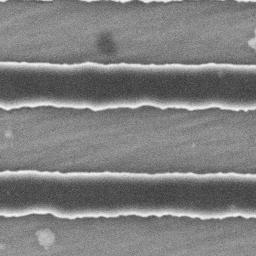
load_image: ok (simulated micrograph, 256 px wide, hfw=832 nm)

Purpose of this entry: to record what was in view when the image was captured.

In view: lines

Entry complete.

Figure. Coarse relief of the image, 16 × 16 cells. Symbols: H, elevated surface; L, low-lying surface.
LLLLLLLLLLLLLLLL
LLLLLLLLLLLLLLLL
LLLLLLLLLLLLLLLL
LLLLLLLLLLLLLLLL
HHHHHHHHHHHHHHHH
HHHHHHHHHHHHHHHH
HHHHHHHHHHHHHHHH
LLLLLLLLLLLLLLLL
LLLLLLLLLLLLLLLL
LLLLLLLLLLLLLLLL
LLLLLLLLLLLLLLLL
HHHHHHHHHHHHHHHH
HHHHHHHHHHHHHHHH
HLLLHHHLLLLHHHHH
LLLLLLLLLLLLLLLL
LLLLLLLLLLLLLLLL